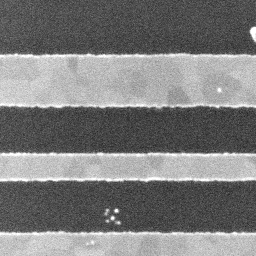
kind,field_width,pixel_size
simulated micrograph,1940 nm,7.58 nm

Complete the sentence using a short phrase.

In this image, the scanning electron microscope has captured lines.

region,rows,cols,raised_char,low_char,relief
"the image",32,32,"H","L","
LLLLLLLLLLLLLLLLLLLLLLLLLLLLLLLL
LLLLLLLLLLLLLLLLLLLLLLLLLLLLLLLL
LLLLLLLLLLLLLLLLLLLLLLLLLLLLLLLL
LLLLLLLLLLLLLLLLLLLLLLLLLLLLLLLL
LLLLLLLLLLLLLLLLLLLLLLLLLLLLLLLL
LLLLLLLLLLLLLLLLLLLLLLLLLLLLLLLL
LLLLLLLLLLLLLLLLLLLLLLLLLLLLLLLL
HHHHHHHHHHHHHHHHHHHHHHHHHHHHHHHH
HHHHHHHHHHHHHHHHHHHHHHHHHHHHHHHH
HHHHHHHHHHHHHHHHHHHHHHHHHHHHHHHH
HHHHHHHHHHHHHHHHHHHHHHHHHHHHHHHH
HHHHHHHHHHHHHHHHHHHHHHHHHHHHHHHH
HHHHHHHHHHHHHHHHHHHHHHHHHHHHHHHH
LLLLLLLLLLLLLLLLLLLLLLLLLLLLLLLL
LLLLLLLLLLLLLLLLLLLLLLLLLLLLLLLL
LLLLLLLLLLLLLLLLLLLLLLLLLLLLLLLL
LLLLLLLLLLLLLLLLLLLLLLLLLLLLLLLL
LLLLLLLLLLLLLLLLLLLLLLLLLLLLLLLL
LLLLLLLLLLLLLLLLLLLLLLLLLLLLLLLL
HHHHHHHHHHHHHHHHHHHHHHHHHHHHHHHH
HHHHHHHHHHHHHHHHHHHHHHHHHHHHHHHH
HHHHHHHHHHHHHHHHHHHHHHHHHHHHHHHH
HHHHHHHHLHHLHHHHLHHLLHHHHHHHHHHL
LLLLLLLLLLLLLLLLLLLLLLLLLLLLLLLL
LLLLLLLLLLLLLLLLLLLLLLLLLLLLLLLL
LLLLLLLLLLLLLLLLLLLLLLLLLLLLLLLL
LLLLLLLLLLLLLLLLLLLLLLLLLLLLLLLL
LLLLLLLLLLLLLLLLLLLLLLLLLLLLLLLL
LLLLLLLLLLLLLLLLLLLLLLLLLLLLLLLL
HHHHHHHHHHHHHHHHHHHHHHHHHHHHHHHH
HHHHHHHHHHHHHHHHHHHHHHHHHHHHHHHH
HHHHHHHHHHHHHHHHHHHHHHHHHHHHHHHH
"